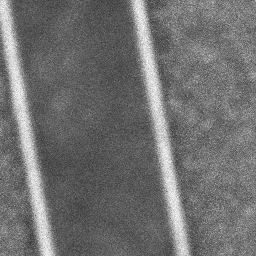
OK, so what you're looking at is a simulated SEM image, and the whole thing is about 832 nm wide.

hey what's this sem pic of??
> one or a few lines or trenches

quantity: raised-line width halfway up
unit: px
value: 134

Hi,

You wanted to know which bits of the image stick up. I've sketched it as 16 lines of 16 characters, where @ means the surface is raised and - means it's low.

@@@@@@@@@-------
@@@@@@@@@-------
-@@@@@@@@-------
-@@@@@@@@-------
-@@@@@@@@-------
-@@@@@@@@@------
-@@@@@@@@@------
-@@@@@@@@@------
--@@@@@@@@------
--@@@@@@@@------
--@@@@@@@@@-----
--@@@@@@@@@-----
--@@@@@@@@@-----
---@@@@@@@@-----
---@@@@@@@@-----
---@@@@@@@@-----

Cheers